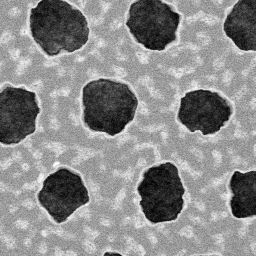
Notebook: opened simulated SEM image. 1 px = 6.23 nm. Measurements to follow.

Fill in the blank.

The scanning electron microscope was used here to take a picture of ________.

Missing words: holes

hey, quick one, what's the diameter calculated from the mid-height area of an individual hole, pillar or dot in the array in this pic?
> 318 nm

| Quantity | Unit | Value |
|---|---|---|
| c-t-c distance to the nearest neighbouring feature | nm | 586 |